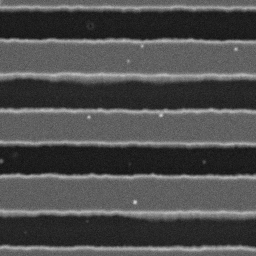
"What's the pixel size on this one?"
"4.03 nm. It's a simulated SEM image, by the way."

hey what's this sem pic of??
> lines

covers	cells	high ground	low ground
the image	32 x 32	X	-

XXXXXXXXXXXXXXXXXXXXXXXXXXXXXXXX
--------------------------------
--------------------------------
--------------------------------
--------------------------------
XXXXXXXXXXXXXXXXXXXXXXXXXXXXXXXX
XXXXXXXXXXXXXXXXXXXXXXXXXXXXXXXX
XXXXXXXXXXXXXXXXXXXXXXXXXXXXXXXX
XXXXXXXXXXXXXXXXXXXXXXXXXXXXXXXX
X-----XX--XXXXXX-XXXXXXXXX-XXX-X
--------------------------------
--------------------------------
--------------------------------
--------------------------------
XXXXXXXXXXXXXXXXXXXXXXXXXXXXXXXX
XXXXXXXXXXXXXXXXXXXXXXXXXXXXXXXX
XXXXXXXXXXXXXXXXXXXXXXXXXXXXXXXX
XXXXXXXXXXXXXXXXXXXXXXXXXXXXXXXX
--------------------------------
--------------------------------
--------------------------------
--------------------------------
XXXXXXXXXXXXXXXXXXXXXXXXXXXXXXXX
XXXXXXXXXXXXXXXXXXXXXXXXXXXXXXXX
XXXXXXXXXXXXXXXXXXXXXXXXXXXXXXXX
XXXXXXXXXXXXXXXXXXXXXXXXXXXXXXXX
XXXXXXXXXXXXXXXXXXXXXXXXXXXXXXXX
--------------------------------
--------------------------------
--------------------------------
--------------------------------
XXXXXXXXXXXXXXXXXXXXXXXXXXXXXXXX